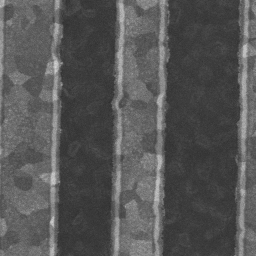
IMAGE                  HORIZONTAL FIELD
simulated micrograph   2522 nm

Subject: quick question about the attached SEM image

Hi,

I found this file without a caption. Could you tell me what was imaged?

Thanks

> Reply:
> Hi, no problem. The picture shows one or a few lines or trenches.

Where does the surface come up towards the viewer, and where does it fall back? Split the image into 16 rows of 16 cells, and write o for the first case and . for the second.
oooo....oo.....o
oooo....oo.....o
ooo.....oo.....o
ooo....ooo.....o
ooo.....oo.....o
ooo.....oo.....o
ooo....ooo.....o
ooo....ooo.....o
ooo....ooo.....o
ooo....ooo.....o
ooo....ooo.....o
ooo....ooo.....o
ooo....ooo.....o
ooo....ooo.....o
ooo....ooo.....o
ooo....ooo.....o